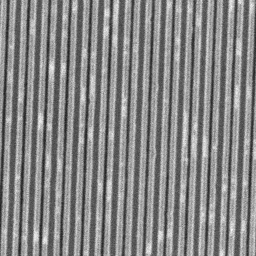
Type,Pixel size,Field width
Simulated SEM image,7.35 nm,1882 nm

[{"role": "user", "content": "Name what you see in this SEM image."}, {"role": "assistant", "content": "parallel lines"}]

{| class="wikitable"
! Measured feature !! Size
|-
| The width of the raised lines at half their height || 37.6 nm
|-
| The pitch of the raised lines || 0.0764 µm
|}